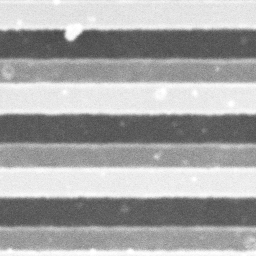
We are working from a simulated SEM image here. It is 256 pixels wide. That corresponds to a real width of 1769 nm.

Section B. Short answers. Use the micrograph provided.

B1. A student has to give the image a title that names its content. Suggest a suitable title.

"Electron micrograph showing lines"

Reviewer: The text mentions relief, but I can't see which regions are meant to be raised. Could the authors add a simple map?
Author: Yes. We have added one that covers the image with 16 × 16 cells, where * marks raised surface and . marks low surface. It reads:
****************
****************
................
................
****************
****************
****************
................
................
****************
****************
****************
................
................
****************
****************